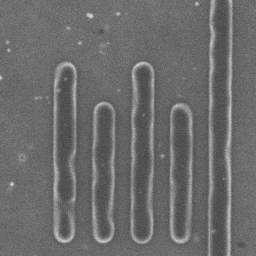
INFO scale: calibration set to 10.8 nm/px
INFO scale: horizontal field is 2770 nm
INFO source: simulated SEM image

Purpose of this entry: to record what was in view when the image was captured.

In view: groups of lines, slits or small figures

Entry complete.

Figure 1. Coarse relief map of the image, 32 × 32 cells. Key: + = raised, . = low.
...........................++...
..........................+++...
..........................+++...
..........................+++...
..........................+++...
..........................+++...
..........................+++...
..........................+++...
.......++........++.......+++...
.......++........++.......+++...
.......++........++.......+++...
.......++........++.......+++...
.......++........++.......+++...
.......++...++...++...+...+++...
.......++...++..+++..+++..+++...
.......++...++..+++..+++..+++...
.......++...++...++..+++..+++...
.......++...++...++..+++..+++...
.......++...++..+++..+++..+++...
.......++...++...++..+++..+++...
.......++...++..+++..+++..+++...
.......++...++..+++..+++..+++...
.......++...++..+++..+++..+++...
.......++...++..+++...++..+++...
.......++...++..+++..+++..+++...
.......++...++..+++..+++..+++...
.......++...++..+++..+++..+++...
.......++...++..+++..+++..+++...
.......++...++..+++..+++..+++...
.......++...++..+++...++..+++...
..........................+++...
..........................+++...